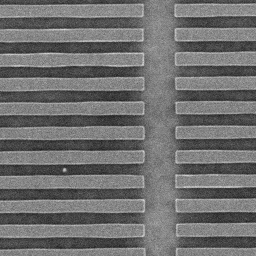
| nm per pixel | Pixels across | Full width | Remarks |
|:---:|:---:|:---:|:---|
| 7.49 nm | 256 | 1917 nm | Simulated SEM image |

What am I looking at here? groups of lines, slits or small figures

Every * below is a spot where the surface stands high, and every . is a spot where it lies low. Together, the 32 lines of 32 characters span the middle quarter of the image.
................................
................................
................................
...................*............
********************........****
********************........****
................................
................................
................................
......**************........****
********************........****
********************........****
*...********....................
................................
................................
................................
********************........****
********************........****
********************........****
................................
................................
................................
********************........****
********************........****
********************........****
................................
................................
................................
********************........****
********************........****
********************........****
................................